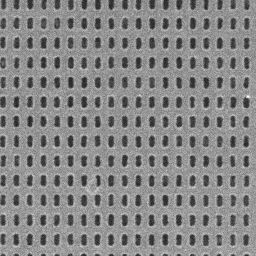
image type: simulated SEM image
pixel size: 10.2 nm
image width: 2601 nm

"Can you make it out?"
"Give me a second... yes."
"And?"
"a regular array of holes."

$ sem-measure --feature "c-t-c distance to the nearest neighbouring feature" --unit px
13.2